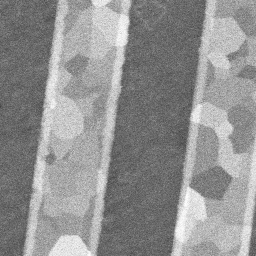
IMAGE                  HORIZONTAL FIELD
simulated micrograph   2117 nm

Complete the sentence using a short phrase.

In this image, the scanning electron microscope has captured one or a few lines or trenches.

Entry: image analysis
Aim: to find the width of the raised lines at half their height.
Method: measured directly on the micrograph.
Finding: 0.521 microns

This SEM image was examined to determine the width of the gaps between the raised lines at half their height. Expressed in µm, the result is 0.702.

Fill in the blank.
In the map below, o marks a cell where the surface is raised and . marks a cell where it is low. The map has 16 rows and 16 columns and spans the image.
....oooo.....ooo
....oooo.....ooo
....oooo.....ooo
....ooo......ooo
...oooo......ooo
...oooo......ooo
...oooo.....oooo
...oooo.....oooo
...oooo.....oooo
...oooo.....oooo
...ooo......oooo
..oooo......oooo
..oooo......oooo
..oooo.....oooo.
..oooo.....oooo.
..oooo.....oooo.